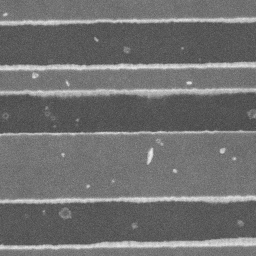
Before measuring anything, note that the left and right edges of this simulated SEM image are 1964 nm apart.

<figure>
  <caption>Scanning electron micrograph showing lines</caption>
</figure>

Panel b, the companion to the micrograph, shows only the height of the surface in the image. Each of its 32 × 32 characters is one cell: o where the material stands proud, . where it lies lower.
oooooooooooooooooooooooooooooooo
oooooooooooooooooooooooooooooooo
ooooooooooooooooooooo...........
................................
................................
................................
................................
................................
oooooooooooooooooooooooooooooooo
oooooooooooooooooooooooooooooooo
oooooooooooooooooooooooooooooooo
oooooo..........................
................................
................................
................................
................................
....................o..ooooooooo
oooooooooooooooooooooooooooooooo
oooooooooooooooooooooooooooooooo
oooooooooooooooooooooooooooooooo
oooooooooooooooooooooooooooooooo
oooooooooooooooooooooooooooooooo
oooooooooooooooooooooooooooooooo
oooooooooooooooooooooooooooooooo
oooooooooooooooooooooooooooooooo
................................
................................
................................
................................
................................
......................o.oooooooo
oooooooooooooooooooooooooooooooo